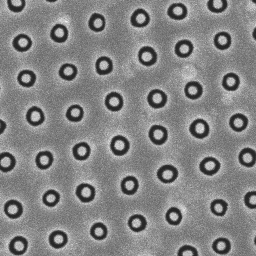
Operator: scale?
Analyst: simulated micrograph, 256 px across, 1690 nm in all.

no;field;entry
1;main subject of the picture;a regular array of ring-shaped grooves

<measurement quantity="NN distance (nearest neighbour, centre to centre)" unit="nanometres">252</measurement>